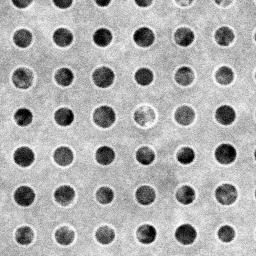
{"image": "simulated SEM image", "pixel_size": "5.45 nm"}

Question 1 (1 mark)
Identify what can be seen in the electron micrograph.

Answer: a regular array of holes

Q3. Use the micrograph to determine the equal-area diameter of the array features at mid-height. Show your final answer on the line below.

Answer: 118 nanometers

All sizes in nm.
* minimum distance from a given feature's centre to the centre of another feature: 214